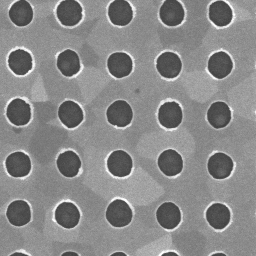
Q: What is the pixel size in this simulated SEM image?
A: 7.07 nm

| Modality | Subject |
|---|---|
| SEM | a regular array of holes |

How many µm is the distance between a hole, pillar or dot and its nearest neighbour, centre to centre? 0.346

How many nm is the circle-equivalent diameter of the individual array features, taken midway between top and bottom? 184